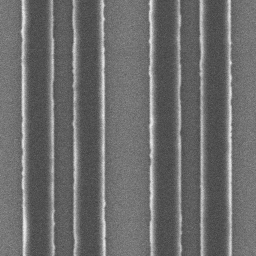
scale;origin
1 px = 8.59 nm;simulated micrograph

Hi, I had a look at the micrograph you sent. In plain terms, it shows lines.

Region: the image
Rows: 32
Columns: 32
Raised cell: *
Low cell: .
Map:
...****..****......***...****...
...****..****......****..****...
...****..****......****..****...
...****..****......****..****...
...****..****......***...****...
...****..****......***...****...
...****..****......***...****...
...****..****......***...****...
...****..****......****..****...
...****..****......****..****...
...****..****......****..****...
...****..****......***...****...
...****..****......***...****...
...****..****......****..****...
...****..****......****..****...
...****..****......****..****...
...****..****......****..****...
...****..****......****..****...
...****..****......****..****...
...****..****......****..****...
...****..****......****..****...
...****..****......****..****...
...****..****......****..****...
...****..****......****..****...
...****..****......****..****...
...****..****......****..****...
...****..****......****..****...
...****..****......****..****...
...****..****......****..****...
...****..****......****..****...
...****..****......****..****...
...****..****......****..****...